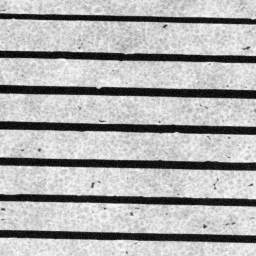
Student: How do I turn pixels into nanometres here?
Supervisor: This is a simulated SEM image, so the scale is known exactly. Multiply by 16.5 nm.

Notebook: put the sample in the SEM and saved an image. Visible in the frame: parallel lines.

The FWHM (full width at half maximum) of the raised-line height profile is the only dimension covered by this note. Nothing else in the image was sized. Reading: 428 nm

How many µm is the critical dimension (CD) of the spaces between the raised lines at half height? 0.132